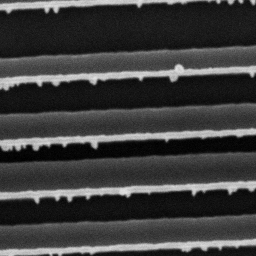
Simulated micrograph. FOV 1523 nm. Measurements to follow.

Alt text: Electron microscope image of lines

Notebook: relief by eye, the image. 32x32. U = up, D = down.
UUUUUUUUUUUUUUUDDUDDDUDDDDDDDDDD
DDDDDDDDDDDDDDDDDDDDDDDDDDDDDDDD
DDDDDDDDDDDDDDDDDDDDDDDDDDDDDDDD
DDDDDDDDDDDDDDDDDDDDDDDDDDDDDDDD
DDDDDDDDDDDDDDDDDDDDDDDDDDDDDDDD
DDDDDDDDDDDDDDDDDDDDDDDDDDDDDDDD
DDDDDDDDDDDDDDDDDDDUUUUUUUUUUUUU
UUUUUUUUUUUUUUUUUUUUUUUUUUUUUUUU
UUUUUUUUUUUUUUUUUUUUUUUUUUUUUUUU
UUUUUUUUUUUUUUUUUUDDDUUDDDDDDDDD
UUDDDDDDDDDDDDDDDDDDDDDDDDDDDDDD
DDDDDDDDDDDDDDDDDDDDDDDDDDDDDDDD
DDDDDDDDDDDDDDDDDDDDDDDDDDDDDDDD
DDDDDDDDDDDDDDDDDDDDDDDUUUUUUUUU
UUUUUUUUUUUUUUUUUUUUUUUUUUUUUUUU
UUUUUUUUUUUUUUUUUUUUUUUUUUUUUUUU
UUUUUUUUUUUUUUUUUUUUUUUUUUUUUUUU
UUUUUUUUUUUUUUUUDDDDDDDDDDDDDDDD
UUUDUDDDDDDDDDDDDDDDDDDDDDDDDDDD
DDDDDDDDDDDDDDDDDDDDDDDUUUUUUUUU
UUUUUUUUUUUUUUUUUUUUUUUUUUUUUUUU
UUUUUUUUUUUUUUUUUUUUUUUUUUUUUUUU
UUUUUUUUUUUUUUUUUUUUUUUUUUUUUUUU
UUUUUUUUUUUUUUUUUUUUUUUUUUUUUUDU
UUUUUUUUUDUDDDDDDDDDDDDDDDDDDDDD
DDDDDDDDDDDDDDDDDDDDDDDDDDDDDDDD
DDDDDDDDDDDDDDDDDDDDDDDDDDDDDDDD
DDDDDDDDDDDDDDDDDDDDUUUUUUUUUUUU
UUUUUUUUUUUUUUUUUUUUUUUUUUUUUUUU
UUUUUUUUUUUUUUUUUUUUUUUUUUUUUUUU
UUUUUUUUUUUUUUUUUUUUUUUUUUUUUUUU
UUUUUUUUUDUUDDDDDDDDDDDDDDDDDDDD